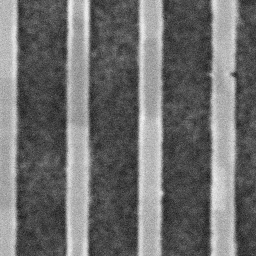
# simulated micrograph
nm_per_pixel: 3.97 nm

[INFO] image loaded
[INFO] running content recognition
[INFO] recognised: one or a few lines or trenches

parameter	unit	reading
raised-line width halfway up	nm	84.4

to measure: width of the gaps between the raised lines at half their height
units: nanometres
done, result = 206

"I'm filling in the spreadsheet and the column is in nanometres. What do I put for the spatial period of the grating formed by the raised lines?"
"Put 289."